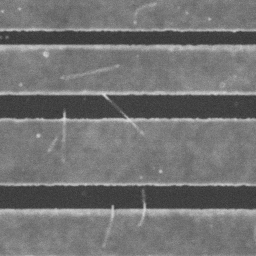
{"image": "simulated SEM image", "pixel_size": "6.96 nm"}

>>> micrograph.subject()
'lines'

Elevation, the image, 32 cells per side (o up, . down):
oooooooooooooooooooooooooooooooo
oooooooooooooooooooooooooooooooo
oooooooooooooooooooooooooooooooo
oooooooooooooooooooooooooooooooo
................................
................................
oooooooooooooooooooooooooooooooo
oooooooooooooooooooooooooooooooo
oooooooooooooooooooooooooooooooo
oooooooooooooooooooooooooooooooo
oooooooooooooooooooooooooooooooo
oooooooooooooooooooooooooooooooo
................................
................................
................................
oooooooooooooooooooooooooooooooo
oooooooooooooooooooooooooooooooo
oooooooooooooooooooooooooooooooo
oooooooooooooooooooooooooooooooo
oooooooooooooooooooooooooooooooo
oooooooooooooooooooooooooooooooo
oooooooooooooooooooooooooooooooo
oooooooooooooooooooooooooooooooo
................................
................................
................................
oooooooooooooooooooooooooooooooo
oooooooooooooooooooooooooooooooo
oooooooooooooooooooooooooooooooo
oooooooooooooooooooooooooooooooo
oooooooooooooooooooooooooooooooo
oooooooooooooooooooooooooooooooo